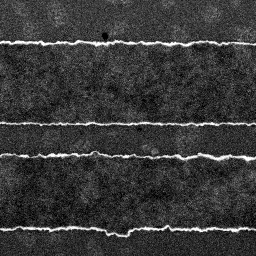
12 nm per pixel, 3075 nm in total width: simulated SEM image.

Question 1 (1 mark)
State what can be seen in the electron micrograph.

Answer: one or a few lines or trenches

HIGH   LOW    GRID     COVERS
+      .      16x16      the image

................
................
................
++++++++++++++++
++++++++++++++++
++++++++++++++++
++++++++++++++++
++++++++++++++++
................
................
++++++++++++++++
++++++++++++++++
++++++++++++++++
++++++++++++++++
.......+........
................